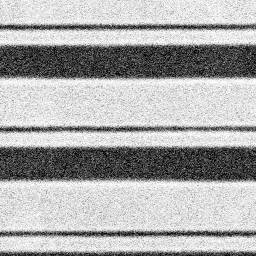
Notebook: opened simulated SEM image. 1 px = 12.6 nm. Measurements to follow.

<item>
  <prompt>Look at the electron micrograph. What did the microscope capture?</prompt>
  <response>lines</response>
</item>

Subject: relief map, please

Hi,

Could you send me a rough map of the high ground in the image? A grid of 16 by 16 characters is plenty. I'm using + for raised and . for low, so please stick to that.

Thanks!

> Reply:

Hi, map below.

++++++++++++++++
++++++++++++++++
++++++++++++++++
................
................
++++++++++++++++
++++++++++++++++
++++++++++++++++
++++++++++++++++
................
................
...............+
++++++++++++++++
++++++++++++++++
++++++++++++++++
++++++++++++++++